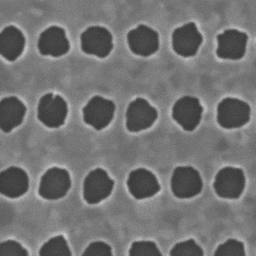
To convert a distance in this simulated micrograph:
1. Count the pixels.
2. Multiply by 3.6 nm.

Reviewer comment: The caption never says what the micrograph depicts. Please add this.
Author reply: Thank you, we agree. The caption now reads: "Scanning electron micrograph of a regular array of holes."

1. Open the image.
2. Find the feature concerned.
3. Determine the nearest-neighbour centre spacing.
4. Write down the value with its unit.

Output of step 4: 156 nm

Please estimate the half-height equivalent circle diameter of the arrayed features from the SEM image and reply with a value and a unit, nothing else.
120 nm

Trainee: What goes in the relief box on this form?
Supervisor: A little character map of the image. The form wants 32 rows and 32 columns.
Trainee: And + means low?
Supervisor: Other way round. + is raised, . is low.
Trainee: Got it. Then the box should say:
++++++++++++++++++++++++++++++++
++++++++++++++++++++++++++++++++
++++++++++++++++++++++++++++++++
+.++++..+++..++++..+++...+++++++
...++...++....++....+....++....+
...++....+....++....+....++....+
...++....+....++....++...++....+
+.++++++++++++++++++++++++++..++
++++++++++++++++++++++++++++++++
++++++++++++++++++++++++++++++++
++++++++++++++++++++++++++++++++
++++++++++++++++++++++++++++++++
...++...+++...+++.++++...+++..++
...++....+....++...+++...++....+
...++...++....++....+....++....+
...++...+++...++...+++...++....+
++++++++++++++++.+++++++++++++++
++++++++++++++++++++++++++++++++
++++++++++++++++++++++++++++++++
++++++++++++++++++++++++++++++++
++++++++++++++++++++++++++++++++
...+++...++..+++...+++...++....+
....+....+....++....+....++....+
....+....+....++....+....++....+
+..++...++....+++..+++...++...++
+++++++++++.++++++++++++++++++++
++++++++++++++++++++++++++++++++
++++++++++++++++++++++++++++++++
++++++++++++++++++++++++++++++++
+++++++.++++++++++++++++++++++++
...++....++..+++....++...+++...+
....+....+....++....+....++....+